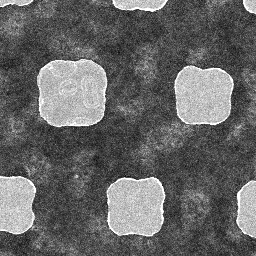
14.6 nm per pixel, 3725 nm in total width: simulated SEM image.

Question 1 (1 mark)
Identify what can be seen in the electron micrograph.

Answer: raised bodies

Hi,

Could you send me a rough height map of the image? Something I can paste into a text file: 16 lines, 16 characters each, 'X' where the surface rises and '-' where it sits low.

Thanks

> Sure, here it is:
-------XXX-----X
----------------
----------------
----------------
-----------XXX--
-----------XXXX-
-----------XXX--
-----------XXX--
----------------
----------------
----------------
XX-----XXX-----X
XX-----XXX-----X
XX-----XXX-----X
X------XXX-----X
----------------